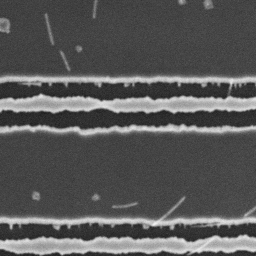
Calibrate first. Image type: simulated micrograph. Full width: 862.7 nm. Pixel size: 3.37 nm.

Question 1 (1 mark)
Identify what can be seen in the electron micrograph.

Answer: lines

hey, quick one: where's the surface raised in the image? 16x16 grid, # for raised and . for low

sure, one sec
################
################
################
################
################
................
................
................
################
################
################
################
################
################
................
................